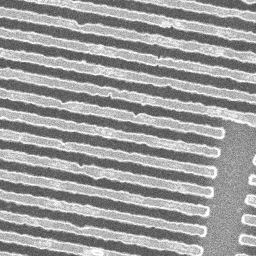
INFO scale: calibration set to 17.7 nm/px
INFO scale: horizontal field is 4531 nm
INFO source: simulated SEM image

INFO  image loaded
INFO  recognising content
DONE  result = parallel lines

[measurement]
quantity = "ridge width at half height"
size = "168 nanometres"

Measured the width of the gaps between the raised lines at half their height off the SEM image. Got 10.3 pixels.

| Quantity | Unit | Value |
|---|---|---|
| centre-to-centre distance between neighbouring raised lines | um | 0.354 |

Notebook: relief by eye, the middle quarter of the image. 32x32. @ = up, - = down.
@@@@@@@@@----------------@@@@@@@
--@@@@@@@@@@@@@---------------@@
-------@@@@@@@@@@@@@------------
-------------@@@@@@@@@@@@@------
@@@---------------@@@@@@@@@@@@@-
@@@@@@@@@--------------@@--@@@@@
-@@@@@@@@@@@@----------------@@@
-------@@@@@@@@@@@@@------------
------------@@@@@@@@@@@@--------
-@@---------------@@@@@@@@@@@@--
@@@@@@@@@-------------@-@@@@@@@@
-@@@@@@@@@@@@---------------@@@@
-----@@@@@@@@@@@@--@------------
------------@@@@@@@@@@@@@@------
@@---------------@@@@@@@@@@@@---
@@@@@@@@---------------@@@@@@@@@
@@@@@@@@@@@@@---------------@@@@
------@@@@@@@@@@@@@@------------
-----------@@@@@@@@@@@@@--------
------------------@@@@@@@@@@@@--
@@@@@@@--------------@@@@@@@@@@@
@@@@@@@@@@@@---------------@@@@@
------@@@@@@@@@@@@@-------------
-----------@@@@@@@@@@@@@--------
@----------------@@@@@@@@@@@@---
@@@@-@@---------------@@@@@@@@@@
@@@@@@@@@@@@---------------@@@@@
-----@@@@@@@@@@@@---------------
-------@@--@@@@@@@@@@@@---------
@@--------------@@@@@@@@@@@@----
@@@@@@--------------@@@@@@@@@@@@
@@@@@@@@@@@@---------------@@@@@